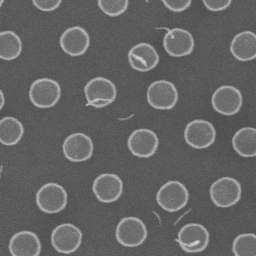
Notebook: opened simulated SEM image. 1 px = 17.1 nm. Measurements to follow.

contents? a regular array of raised bodies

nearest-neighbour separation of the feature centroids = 786 nm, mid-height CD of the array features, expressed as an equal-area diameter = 493 nanometers